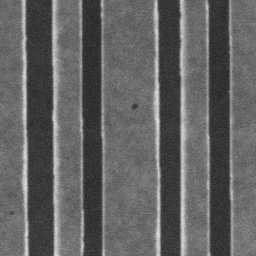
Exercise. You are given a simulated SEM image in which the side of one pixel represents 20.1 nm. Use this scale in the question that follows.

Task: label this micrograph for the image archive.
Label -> lines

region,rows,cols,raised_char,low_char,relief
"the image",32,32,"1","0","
11100001110001111111000111000111
11100001110001111111000111000111
11100001110001111111000111000111
11100001110001111111000111000111
11100001110001111111000111000111
11100001110001111111000111000111
11100001110001111111000111000111
11100001110001111111000111000111
11100001110001111111000111000111
11100001110001111111000111000111
11100001110001111111000111000111
11100001110001111111000111000111
11100001110001111111000111000111
11100001110001111111000111000111
11100001110001111111000111000111
11100001110001111111000111000111
11100001110001111111000111000111
11100001110001111111000111000111
11100001110001111111000111000111
11100001110001111111000111000111
11100001110001111111000111000111
11100001110001111111000111000111
11100001110001111111000111000111
11100001110001111111000111000111
11100001110001111111000111000111
11100001110001111111000111000111
11100001110001111111000111000111
11100001110001111111000111000111
11100001110001111111000111000111
11100001110001111111000111000111
11100001110001111111000111000111
11100001110001111111000111000111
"